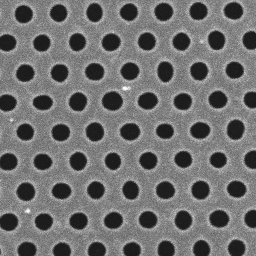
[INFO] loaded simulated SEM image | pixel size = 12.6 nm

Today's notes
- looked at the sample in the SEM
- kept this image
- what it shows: a regular array of holes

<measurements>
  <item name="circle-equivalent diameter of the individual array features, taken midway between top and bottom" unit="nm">233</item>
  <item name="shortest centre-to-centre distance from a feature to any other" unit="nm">430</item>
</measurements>